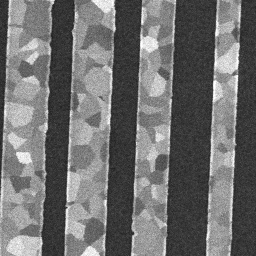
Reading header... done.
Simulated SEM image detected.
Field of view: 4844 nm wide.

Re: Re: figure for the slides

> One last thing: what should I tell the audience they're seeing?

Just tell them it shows one or a few lines or trenches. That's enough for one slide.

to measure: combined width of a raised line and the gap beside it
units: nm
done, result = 1250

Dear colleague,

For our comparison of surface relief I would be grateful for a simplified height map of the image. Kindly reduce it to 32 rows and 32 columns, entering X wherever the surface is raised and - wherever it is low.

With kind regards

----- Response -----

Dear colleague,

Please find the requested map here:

-XXXXX---XXXXX----XXXX-----XXX--
-XXXXX----XXXX----XXXX-----XXX--
-XXXXX---XXXXX----XXXX-----XXX--
-XXXXX---XXXXX----XXXX-----XXX--
-XXXXX---XXXXX----XXXX-----XXX--
-XXXXX---XXXXX----XXXX-----XXX--
-XXXXX---XXXXX----XXXX-----XXX--
-XXXXX---XXXXX----XXXX-----XXX--
-XXXXX---XXXXX---XXXXX-----XXX--
-XXXXX---XXXXX----XXXX-----XXX--
-XXXXX---XXXXX---XXXX------XXX--
-XXXXX---XXXXX---XXXXX-----XXX--
-XXXXX---XXXXX---XXXX------XX---
-XXXXX---XXXXX---XXXX------XX---
-XXXXX---XXXXX---XXXX------XX---
-XXXXX---XXXXX---XXXX------XX---
-XXXXX---XXXXX---XXXX-----XXX---
XXXXXX---XXXXX---XXXX------XX---
XXXXXX---XXXX----XXXX------XX---
XXXXXX---XXXXX---XXXX-----XXX---
XXXXX----XXXX----XXXX-----XXX---
XXXXXX---XXXX----XXXX-----XXX---
XXXXXX---XXXX----XXXX-----XXX---
XXXXXX--XXXXX----XXXX-----XXX---
XXXXXX--XXXXX----XXXX-----XXX---
XXXXX---XXXXX----XXXX-----XXX---
XXXXX---XXXXX----XXXX-----XXX---
XXXXX---XXXXX----XXXX-----XXX---
XXXXX---XXXXX----XXXX-----XXX---
XXXXX---XXXXX----XXXX-----XXX---
XXXXX---XXXXX----XXXX-----XXX---
XXXXX---XXXXX----XXXX-----XXX---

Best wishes